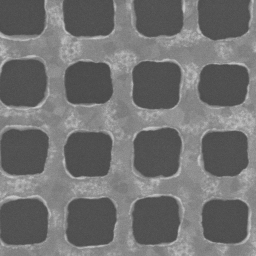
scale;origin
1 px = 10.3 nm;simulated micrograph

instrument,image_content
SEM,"a regular array of holes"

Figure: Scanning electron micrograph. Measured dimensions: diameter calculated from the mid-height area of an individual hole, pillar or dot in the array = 520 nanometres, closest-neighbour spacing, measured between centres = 688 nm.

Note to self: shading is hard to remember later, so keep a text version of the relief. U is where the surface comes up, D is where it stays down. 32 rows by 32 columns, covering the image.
DDDDDDUUDDDDDDUUDDDDDDDUUDDDDDDU
DDDDDDUUDDDDDDUUUDDDDDDUUDDDDDDU
DDDDDDUUDDDDDDUUUDDDDDDUUDDDDDDU
DDDDDDUUDDDDDDUUUDDDDDDUUDDDDDDU
UDDDDUUUUDDDUUUUUUDDDDUUUUDDDDUU
UUUUUUUUUUUUUUUUUUUUUUUUUUUUUUUU
UUUUUUUUUUUUUUUUUUUUUUUUUUUUUUUU
UDDDDUUUUUUUUUUUUUUUUUUUUUUUUUUU
DDDDDDUUDDDDDDUUUDDDDDUUUDDDDDDU
DDDDDDUUDDDDDDUUDDDDDDDUUDDDDDDU
DDDDDDUUDDDDDDUUUDDDDDDUUDDDDDDU
DDDDDDUUDDDDDDUUUDDDDDUUUDDDDDDU
DDDDDDUUDDDDDDUUUDDDDDUUUDDDDDDU
UUUUUUUUUUUUUUUUUUDDDUUUUUUUUUUU
UUUUUUUUUUUUUUUUUUUUUUUUUUUUUUUU
UUUUUUUUUUUUUUUUUUUUUUUUUUUUUUUU
DDDDDUUUUDDDDUUUUDDDDDUUUUDDDDUU
DDDDDDUUDDDDDDUUUDDDDDDUUDDDDDDU
DDDDDDUUDDDDDDUUUDDDDDDUUDDDDDDU
DDDDDDUUDDDDDDUUUDDDDDDUUDDDDDDU
DDDDDDUUDDDDDDUUUDDDDDDUUDDDDDDU
DDDDDUUUUDDDDDUUUDDDDDUUUUDDDDUU
UUUUUUUUUUUUUUUUUUUUUUUUUUUUUUUU
UUUUUUUUUUUUUUUUUUUUUUUUUUUUUUUU
UUUUUUUUUUUUUUUUUUUUDUUUUUUUUUUU
DDDDDUUUUDDDDDUUUDDDDDDUUUDDDDDU
DDDDDDUUDDDDDDDUDDDDDDDUUDDDDDDU
DDDDDDUUDDDDDDDUDDDDDDDUUDDDDDDU
DDDDDDUUDDDDDDUUDDDDDDUUUDDDDDDU
DDDDDDUUDDDDDDUUUDDDDDUUUUDDDDDU
UDDDDUUUUDDDDUUUUDDDDUUUUUUUDUUU
UUUUUUUUUUUUUUUUUUUUUUUUUUUUUUUU